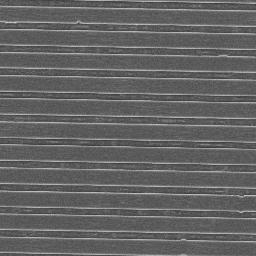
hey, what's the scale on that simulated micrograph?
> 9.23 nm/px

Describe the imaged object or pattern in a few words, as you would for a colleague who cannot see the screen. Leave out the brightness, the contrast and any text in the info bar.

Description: parallel lines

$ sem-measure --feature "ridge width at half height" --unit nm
154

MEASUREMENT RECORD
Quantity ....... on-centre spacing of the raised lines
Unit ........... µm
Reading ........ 0.213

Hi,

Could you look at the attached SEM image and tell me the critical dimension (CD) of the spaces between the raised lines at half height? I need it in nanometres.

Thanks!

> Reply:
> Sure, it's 64.6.